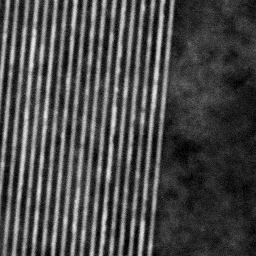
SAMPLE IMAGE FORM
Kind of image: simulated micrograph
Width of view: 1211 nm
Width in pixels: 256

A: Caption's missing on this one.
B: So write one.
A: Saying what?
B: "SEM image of parallel lines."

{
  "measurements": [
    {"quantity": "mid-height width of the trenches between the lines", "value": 32.3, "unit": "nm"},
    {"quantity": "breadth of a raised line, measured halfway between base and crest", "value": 14.7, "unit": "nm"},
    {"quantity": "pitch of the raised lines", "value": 45.6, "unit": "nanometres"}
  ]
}